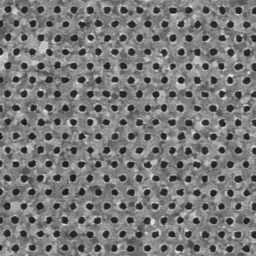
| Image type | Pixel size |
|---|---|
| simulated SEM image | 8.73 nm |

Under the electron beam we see a regular array of holes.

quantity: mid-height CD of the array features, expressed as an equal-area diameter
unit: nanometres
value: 68.3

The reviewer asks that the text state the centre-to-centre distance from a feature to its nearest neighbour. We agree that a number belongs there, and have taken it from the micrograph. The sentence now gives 137 nanometres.